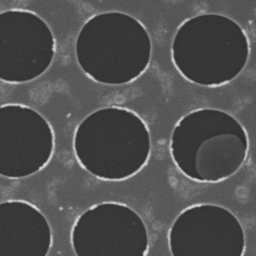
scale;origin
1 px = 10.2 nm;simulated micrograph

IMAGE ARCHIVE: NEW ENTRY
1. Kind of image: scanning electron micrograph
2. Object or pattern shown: holes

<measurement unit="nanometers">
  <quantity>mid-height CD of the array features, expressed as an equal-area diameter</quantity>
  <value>743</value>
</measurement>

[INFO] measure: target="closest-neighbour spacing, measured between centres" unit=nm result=977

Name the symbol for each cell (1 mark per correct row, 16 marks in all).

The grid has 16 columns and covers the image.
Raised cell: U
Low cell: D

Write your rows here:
UUUUUUUUUUUUUUUU
DDDUUDDDDUUUDDDU
DDDUUDDDDUUDDDDU
DDDUUDDDDUUDDDDU
DDDUUDDDDUUDDDDU
UUUUUUUUUUUUUUUU
UUUUUUUUUUUUUUUU
DDDUUDDDDUUDDDDU
DDDUUDDDDUUDDDDU
DDDUUDDDDUUDDDDU
DDUUUDDDDUUDDDDU
UUUUUUUUUUUUUUUU
UUUUUUUUUUUUUUUU
DDDUUDDDDUUDDDDU
DDDUUDDDDUUDDDDU
DDDUUDDDDUUDDDDU